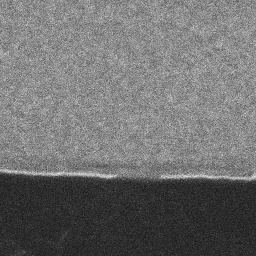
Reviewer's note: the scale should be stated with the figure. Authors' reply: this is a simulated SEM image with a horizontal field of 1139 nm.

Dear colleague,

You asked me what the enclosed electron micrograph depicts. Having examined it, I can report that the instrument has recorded one or a few lines or trenches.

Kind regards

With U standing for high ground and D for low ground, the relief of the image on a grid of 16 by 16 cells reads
DDDDDDDDDDDDDDDD
DDDDDDDDDDDDDDDD
DDDDDDDDDDDDDDDD
DDDDDDDDDDDDDDDD
DDDDDDDDDDDDDDDD
DDDDDDDDDDDDDDDD
DDDDDDDDDDDDDDDD
DDDDDDDDDDDDDDDD
DDDDDDDDDDDDDDDD
DDDDDDDDDDDDDDDD
UDDDDDDDDDDDDDDD
UUUUUUUUUUUUUUUU
UUUUUUUUUUUUUUUU
UUUUUUUUUUUUUUUU
UUUUUUUUUUUUUUUU
UUUUUUUUUUUUUUUU